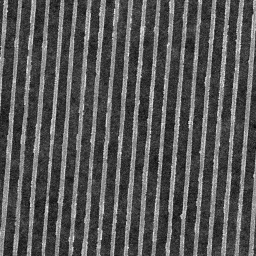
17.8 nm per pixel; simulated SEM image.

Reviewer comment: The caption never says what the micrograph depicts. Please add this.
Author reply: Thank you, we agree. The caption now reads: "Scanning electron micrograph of parallel lines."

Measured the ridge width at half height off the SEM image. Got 66.5 nm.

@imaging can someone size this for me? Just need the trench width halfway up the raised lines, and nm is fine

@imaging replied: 184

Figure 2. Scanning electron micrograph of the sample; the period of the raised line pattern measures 246 nm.